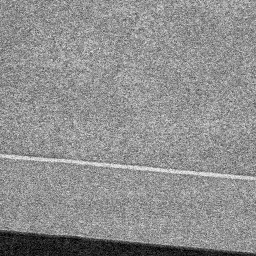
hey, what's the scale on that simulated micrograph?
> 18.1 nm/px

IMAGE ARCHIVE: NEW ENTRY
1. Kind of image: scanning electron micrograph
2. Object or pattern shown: one or a few lines or trenches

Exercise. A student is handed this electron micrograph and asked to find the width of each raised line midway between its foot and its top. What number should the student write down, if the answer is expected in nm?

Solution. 1360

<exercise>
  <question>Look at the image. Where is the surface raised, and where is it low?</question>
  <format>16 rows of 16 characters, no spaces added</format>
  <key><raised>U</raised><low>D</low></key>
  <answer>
DDDDDDDDDDDDDDDD
DDDDDDDDDDDDDDDD
DDDDDDDDDDDDDDDD
DDDDDDDDDDDDDDDD
DDDDDDDDDDDDDDDD
DDDDDDDDDDDDDDDD
DDDDDDDDDDDDDDDD
DDDDDDDDDDDDDDDD
DDDDDDDDDDDDDDDD
DDDDDDDDDDDDDDDD
UUUUUUUUUDDDDDDD
UUUUUUUUUUUUUUUU
UUUUUUUUUUUUUUUU
UUUUUUUUUUUUUUUU
DUUUUUUUUUUUUUUU
DDDDDDDDDDDDUUUU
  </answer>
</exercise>